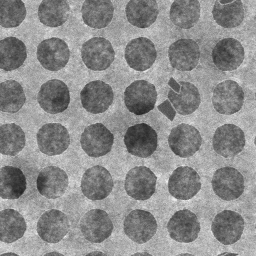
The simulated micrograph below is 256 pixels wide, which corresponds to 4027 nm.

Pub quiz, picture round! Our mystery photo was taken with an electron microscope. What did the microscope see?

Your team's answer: a regular array of holes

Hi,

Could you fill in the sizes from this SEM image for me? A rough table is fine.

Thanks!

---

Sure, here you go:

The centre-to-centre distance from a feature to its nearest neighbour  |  674 nm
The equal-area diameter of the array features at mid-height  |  538 nanometers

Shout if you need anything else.